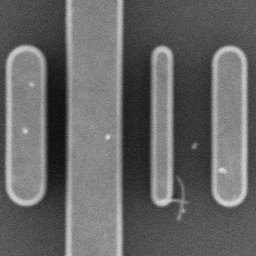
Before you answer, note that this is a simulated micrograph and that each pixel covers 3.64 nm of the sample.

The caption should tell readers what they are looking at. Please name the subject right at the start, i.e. groups of lines, slits or small figures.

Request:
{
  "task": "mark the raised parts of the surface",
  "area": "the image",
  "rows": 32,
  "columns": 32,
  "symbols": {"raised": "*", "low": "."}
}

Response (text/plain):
.........******.................
.........******.................
.........******.................
.........******.................
.........******.................
.........******.................
..***....******....**......***..
.****....******....**......****.
.*****...******....**......****.
.*****...******....**......****.
.*****...******....**......****.
.*****...******....**......****.
.*****...******....**......****.
.*****...******....**......****.
.*****...******....**......****.
.*****...******....**......****.
.*****...******....**......****.
.*****...******....**......****.
.*****...******....**......****.
.*****...******....**......****.
.*****...******....**......****.
.*****...******....**......****.
.*****...******....**......****.
.*****...******....**......****.
..***....******....**......***..
.........******.................
.........******.................
.........******.................
.........******.................
.........******.................
.........******.................
.........******.................